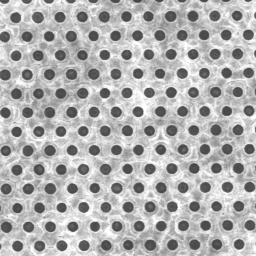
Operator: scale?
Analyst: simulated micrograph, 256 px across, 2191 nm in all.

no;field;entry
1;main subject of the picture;a regular array of holes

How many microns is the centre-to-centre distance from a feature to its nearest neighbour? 0.185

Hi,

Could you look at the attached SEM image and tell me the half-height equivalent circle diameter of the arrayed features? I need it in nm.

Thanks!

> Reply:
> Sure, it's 96.1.